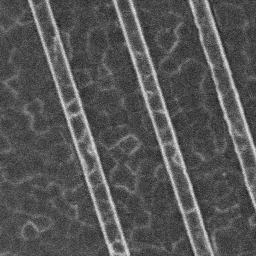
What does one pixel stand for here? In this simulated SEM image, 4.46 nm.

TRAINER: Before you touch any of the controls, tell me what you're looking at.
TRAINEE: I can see one or a few lines or trenches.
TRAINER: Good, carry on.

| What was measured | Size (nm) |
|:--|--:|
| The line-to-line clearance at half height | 280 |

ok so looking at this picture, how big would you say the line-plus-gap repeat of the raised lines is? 77.6 pixels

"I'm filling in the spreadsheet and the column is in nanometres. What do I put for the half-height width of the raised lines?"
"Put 76.5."